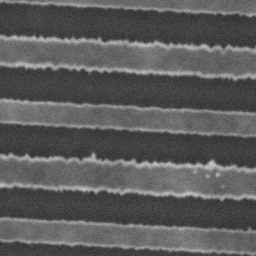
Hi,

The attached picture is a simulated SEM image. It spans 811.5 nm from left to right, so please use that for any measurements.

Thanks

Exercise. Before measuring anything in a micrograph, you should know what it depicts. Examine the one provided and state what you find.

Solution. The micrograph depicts lines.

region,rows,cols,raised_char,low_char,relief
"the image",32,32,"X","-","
----XXXXXXXXXXXXXXXXXXXXXXXXXXXX
------------------------XXXXXXXX
--------------------------------
--------------------------------
X-------------------------------
XXXXXXXXXXXXXXXXXXXXX-----------
XXXXXXXXXXXXXXXXXXXXXXXXXXXXXXXX
XXXXXXXXXXXXXXXXXXXXXXXXXXXXXXXX
------X-XXXXXXXXXXXXXXXXXXXXXXXX
-------------------------XXXXXXX
--------------------------------
--------------------------------
X-------------------------------
XXXXXXXXXXXXXXXXX---------------
XXXXXXXXXXXXXXXXXXXXXXXXXXXXXXXX
--XXXXXXXXXXXXXXXXXXXXXXXXXXXXXX
---------------------XXXXXXXXXXX
--------------------------------
--------------------------------
XX------------------------------
XXXXXXXXXXXXXXXXXXXXXX-X--X-----
XXXXXXXXXXXXXXXXXXXXXXXXXXXXXXXX
XXXXXXXXXXXXXXXXXXXXXXXXXXXXXXXX
----XXXXXXXXXXXXXXXXXXXXXXXXXXXX
----------------------X--XXXXXXX
--------------------------------
--------------------------------
XXXXX---------------------------
XXXXXXXXXXXXXXXXXXXXXXXX--------
XXXXXXXXXXXXXXXXXXXXXXXXXXXXXXXX
--------XXXXXXXXXXXXXXXXXXXXXXXX
-------------------------XXXXXXX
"